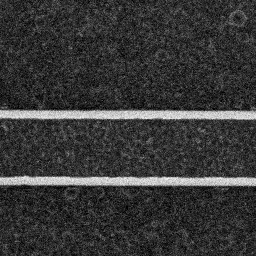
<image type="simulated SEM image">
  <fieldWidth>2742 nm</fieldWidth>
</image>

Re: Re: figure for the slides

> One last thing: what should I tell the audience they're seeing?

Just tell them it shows one or a few lines or trenches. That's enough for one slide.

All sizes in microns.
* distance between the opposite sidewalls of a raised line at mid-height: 0.736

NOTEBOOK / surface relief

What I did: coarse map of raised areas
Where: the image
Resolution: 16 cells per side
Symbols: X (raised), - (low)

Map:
----------------
----------------
----------------
----------------
----------------
----------------
----------------
XXXXXXXXXXXXXXXX
XXXXXXXXXXXXXXXX
XXXXXXXXXXXXXXXX
XXXXXXXXXXXXXXXX
----------------
----------------
----------------
----------------
----------------